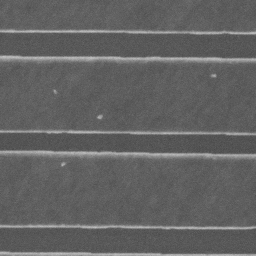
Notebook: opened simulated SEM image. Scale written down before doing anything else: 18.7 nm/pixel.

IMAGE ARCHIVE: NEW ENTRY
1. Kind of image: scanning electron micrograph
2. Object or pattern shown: lines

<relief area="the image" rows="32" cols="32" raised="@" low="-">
@@@@@@@@@@@@@@@@@@@@@@@@@@@@@@@@
@@@@@@@@@@@@@@@@@@@@@@@@@@@@@@@@
@@@@@@@@@@@@@@@@@@@@@@@@@@@@@@@@
@@@@@@@@@@@@@@@@@@@@@@@@@@@@@@@@
--------------------------------
--------------------------------
--------------------------------
@@@@@@@@@@@@@@@@@@@@@@@@@@@@@@@@
@@@@@@@@@@@@@@@@@@@@@@@@@@@@@@@@
@@@@@@@@@@@@@@@@@@@@@@@@@@@@@@@@
@@@@@@@@@@@@@@@@@@@@@@@@@@@@@@@@
@@@@@@@@@@@@@@@@@@@@@@@@@@@@@@@@
@@@@@@@@@@@@@@@@@@@@@@@@@@@@@@@@
@@@@@@@@@@@@@@@@@@@@@@@@@@@@@@@@
@@@@@@@@@@@@@@@@@@@@@@@@@@@@@@@@
@@@@@@@@@@@@@@@@@@@@@@@@@@@@@@@@
---------@@@@@@@@@@@@@@@@@@@@@@@
--------------------------------
--------------------------------
@@@@@@@@@@@@@@@@@@@@@@@@@@@@@@@@
@@@@@@@@@@@@@@@@@@@@@@@@@@@@@@@@
@@@@@@@@@@@@@@@@@@@@@@@@@@@@@@@@
@@@@@@@@@@@@@@@@@@@@@@@@@@@@@@@@
@@@@@@@@@@@@@@@@@@@@@@@@@@@@@@@@
@@@@@@@@@@@@@@@@@@@@@@@@@@@@@@@@
@@@@@@@@@@@@@@@@@@@@@@@@@@@@@@@@
@@@@@@@@@@@@@@@@@@@@@@@@@@@@@@@@
@@@@@@@@@@@@@@@@@@@@@@@@@@@@@@@@
----------------------@-@@@@@@@@
--------------------------------
--------------------------------
--------------------------------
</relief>